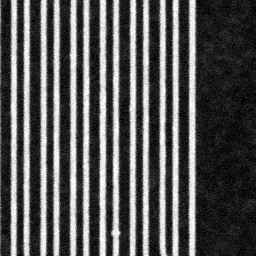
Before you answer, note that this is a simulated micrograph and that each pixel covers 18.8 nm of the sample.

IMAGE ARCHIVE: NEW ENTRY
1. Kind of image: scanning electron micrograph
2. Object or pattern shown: parallel lines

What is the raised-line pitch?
278 nanometres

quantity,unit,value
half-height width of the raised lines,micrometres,0.0821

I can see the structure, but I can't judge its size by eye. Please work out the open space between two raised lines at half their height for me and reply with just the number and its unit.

169 nm